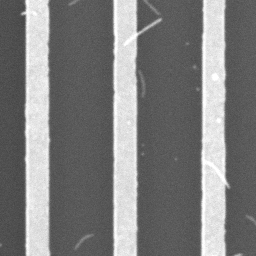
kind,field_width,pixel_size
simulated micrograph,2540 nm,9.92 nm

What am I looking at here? lines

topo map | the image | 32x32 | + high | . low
...+++........+++.........++....
...+++........+++.........++....
...+++........+++.........++....
...+++........+++.........++....
...+++........+++........+++....
...+++........+++........+++....
...+++........+++........+++....
...+++........+++........+++....
...+++........+++........+++....
...+++........+++........+++....
...+++........+++........+++....
...+++........+++........+++....
...+++........+++........+++....
...+++........+++........+++....
...+++........+++........+++....
...+++........+++........+++....
...+++........+++........+++....
...+++........+++........+++....
...+++........+++........+++....
...+++........+++........+++....
...+++........+++........+++....
...+++........+++........+++....
...+++........+++........+++....
...+++........+++........+++....
...+++........+++........+++....
...+++........+++........+++....
...+++........+++........+++....
...+++........+++........+++....
...+++........+++........+++....
...+++........+++........+++....
...+++........+++........+++....
...+++........+++........+++....